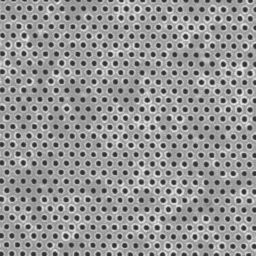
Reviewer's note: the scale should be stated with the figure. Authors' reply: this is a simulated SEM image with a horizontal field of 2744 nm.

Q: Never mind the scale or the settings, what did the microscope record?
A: a regular array of holes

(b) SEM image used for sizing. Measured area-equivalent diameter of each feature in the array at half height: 56.7 nm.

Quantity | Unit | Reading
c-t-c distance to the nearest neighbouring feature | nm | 110